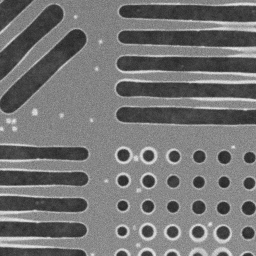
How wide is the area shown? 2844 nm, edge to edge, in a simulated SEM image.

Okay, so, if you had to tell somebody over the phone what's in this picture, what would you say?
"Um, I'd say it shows groups of lines, slits or small figures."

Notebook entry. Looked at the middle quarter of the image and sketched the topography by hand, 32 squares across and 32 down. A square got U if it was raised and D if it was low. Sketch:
UUUUUUUUUUUUUDDDDDDDDDDDDDDDDDDD
UUUUUUUUUUUUUUDDDDDDDDDDDDDDDDDD
UUUUUUUUUUUUUUUUUUUUUUUUUUUUUUUU
UUUUUUUUUUUUUUUUUUUUUUUUUUUUUUUU
UUUUUUUUUUUUUUDDDDDDDDDUDDDDUUUU
UUUUUUUUUUUUUDDDDDDDDDDDDDDDDDDD
UUUUUUUUUUUUUDDDDDDDDDDDDDDDDDDD
UUUUUUUUUUUUUDDDDDDDDDDDDDDDDDDD
UUUUUUUUUUUUUUUUUUUUUUUUDDDDDDDD
UUUUUUUUUUUUUUUUUUUUUUUUUUUUUUUU
UUUUUUUUUUUUUUUUUUUUUUUUUUUUUUUU
UUUUUUUUUUUUUDDDDDDDDDDDDDDDDDDD
UUUUUUUUUUUUUDDDDDDDDDDDDDDDDDDD
UUUUUUUUUUUUUDDDDDDDDDDDDDDDDDDD
UUUUUUUUUUUUUUUDDDDDDDDDDDDDDDDD
UUUUUUUUUUUUUUUUUUUUUUUUUUUUUUUU
UUUUUUUUUUUUUUUUUUUUUUUUUUUUUUUU
UUUUUUUUUUUUUUUUUUUUUUUUUUUUUUUU
UUUUUUUUUUUUUUUUUUUUUUUUUUUUUUUU
UUUUUUUUUUUUUUUUUUUUUUUUUUUUUUUU
UUUUUUUUUUUUUUUUUUUUUUUUUUUUUUUU
DDDDDDUUUUUUUUDDUUUUDDUUUUUDUUUU
DDDDDDUUUUUUUDDDDUUDDDDUUUDDDUUU
DDDDDDUUUUUUUDDDDUUDDDDUUUDDDUUU
UUUUUUUUUUUUUUDDUUUUDDUUUUUDUUUU
UUUUUUUUUUUUUUUUUUUUUUUUUUUUUUUU
UUUUUUUUUUUUUUUUUUUUUUUUUUUUUUUU
DDDDDDUUUUUUUUUUUUUUUUUUUUUUUUUU
DDDDDDUUUUUUUDDDUUUUDDDUUUDDDUUU
DDDDDDUUUUUUUDDDUUUDDDDUUUDDDUUU
UUDDUUUUUUUUUUDDUUUUDDUUUUDDUUUU
UUUUUUUUUUUUUUUUUUUUUUUUUUUUUUUU